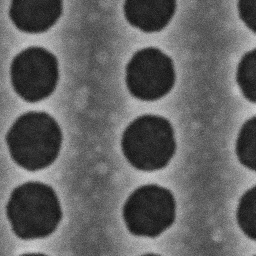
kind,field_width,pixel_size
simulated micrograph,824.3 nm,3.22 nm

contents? holes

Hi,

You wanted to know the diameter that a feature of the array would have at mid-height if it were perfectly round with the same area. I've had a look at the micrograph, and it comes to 54.9 pixels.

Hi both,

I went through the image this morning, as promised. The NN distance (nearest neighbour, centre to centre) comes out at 219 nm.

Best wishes